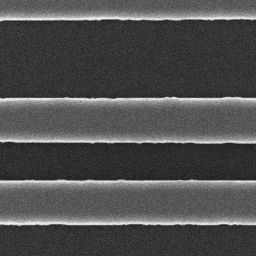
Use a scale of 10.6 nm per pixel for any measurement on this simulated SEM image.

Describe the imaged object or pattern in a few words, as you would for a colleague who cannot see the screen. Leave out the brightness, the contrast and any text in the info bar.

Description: lines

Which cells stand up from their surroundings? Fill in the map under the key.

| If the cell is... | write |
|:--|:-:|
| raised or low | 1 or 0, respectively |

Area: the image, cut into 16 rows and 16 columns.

1111111111111111
0000000000000000
0000000000000000
0000000000000000
0000000000000000
0000000000000000
1111111111111111
1111111111111111
1111111111111111
0000000000000000
0000000000000000
1111111111111111
1111111111111111
1111111111111111
0000000000000000
0000000000000000